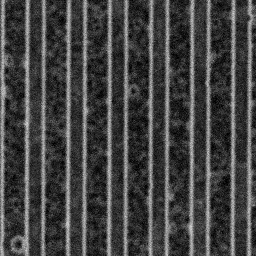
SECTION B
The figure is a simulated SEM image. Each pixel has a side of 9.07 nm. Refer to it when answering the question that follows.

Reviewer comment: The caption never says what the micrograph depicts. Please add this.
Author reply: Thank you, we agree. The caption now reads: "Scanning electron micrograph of parallel lines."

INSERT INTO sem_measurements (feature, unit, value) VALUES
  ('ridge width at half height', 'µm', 0.228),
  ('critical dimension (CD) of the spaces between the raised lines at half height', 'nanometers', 146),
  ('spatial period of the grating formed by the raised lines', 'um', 0.373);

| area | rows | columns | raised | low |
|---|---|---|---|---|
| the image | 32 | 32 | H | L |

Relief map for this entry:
HHHLLLHHHLLHHHLLHHHLLHHHLLHHHLLH
HHHLLLHHHLLHHHLLHHHLLHHHLLHHHLLH
HHHLLLHHHLLHHHLLHHHLLHHHLLHHHLLH
HHHLLLHHHLLHHHLLHHHLLHHHLLHHHLLH
HHHLLLHHHLLHHHLLHHHLLHHHLLHHHLLH
HHHLLLHHHLLHHHLLHHHLLHHHLLHHHLLH
HHHLLLHHHLLHHHLLHHHLLHHHLLHHHLLH
HHHLLLHHHLLHHHLLHHHLLHHHLLHHHLLH
HHHLLLHHHLLHHHLLHHHLLHHHLLHHHLLH
HHHLLLHHHLLHHHLLHHHLLHHHLLHHHLLH
HHHLLLHHHLLHHHLLHHHLLHHHLLHHHLLH
HHHLLLHHHLLHHHLLHHHLLHHHLLHHHLLH
HHHLLLHHHLLHHHLLHHHLLHHHLLHHHLLH
HHHLLLHHHLLHHHLLHHHLLHHHLLHHHLLH
HHHLLLHHHLLHHHLLHHHLLHHHLLHHHLLH
HHHLLLHHHLLHHHLLHHHLLHHHLLHHHLLH
HHHLLHHHHLLHHHLLHHHLLHHHLLHHHLLH
HHHLLHHHHLLHHHLLHHHLLHHHLLHHHLLH
HHHLLHHHHLLHHHLLHHHLLHHHLLHHHLLH
HHHLLHHHLLLHHHLLHHHLLHHHLLHHHLLH
HHHLLHHHLLLHHHLLHHHLLHHHLLHHHLLH
HHHLLHHHLLLHHHLLHHHLLHHHLLHHHLLH
HHHLLHHHLLLHHHLLHHHLLHHHLLHHHLLH
HHHLLHHHLLLHHHLLHHHLLHHHLLHHHLLH
HHHLLHHHLLLHHHLLHHHLLHHHLLHHHLLH
HHHLLHHHLLLHHHLLHHHLLHHHLLHHHLLH
HHHLLHHHLLLHHHLLHHHLLHHHLLHHHLLH
HHHLLHHHLLLHHHLLHHHLLHHHLLHHHLLH
HHHLLHHHLLHHHHLLHHHLLHHHLLHHHLLH
HHHLLHHHLLLHHHLLHHHLLHHHLLHHHLLH
HHHLLHHHLLLHHHLLHHHLLHHHLLHHHLLH
HHHLLHHHLLLHHHLLHHHLLHHHLLHHHLLH